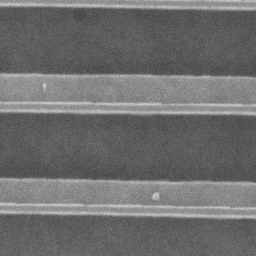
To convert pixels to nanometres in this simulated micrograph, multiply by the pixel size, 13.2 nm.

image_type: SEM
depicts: lines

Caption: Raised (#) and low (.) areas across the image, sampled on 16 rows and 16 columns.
.............###
................
................
................
................
################
################
................
................
................
................
################
################
..............##
................
................